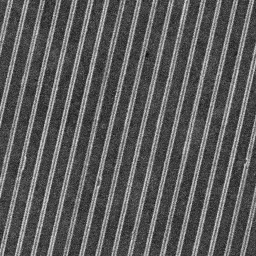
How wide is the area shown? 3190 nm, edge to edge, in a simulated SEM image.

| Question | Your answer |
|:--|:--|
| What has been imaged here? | parallel lines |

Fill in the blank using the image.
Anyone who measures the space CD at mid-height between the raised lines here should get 149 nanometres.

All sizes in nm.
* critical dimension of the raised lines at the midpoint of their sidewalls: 42.5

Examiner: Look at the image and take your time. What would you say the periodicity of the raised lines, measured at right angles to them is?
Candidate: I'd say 196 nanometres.